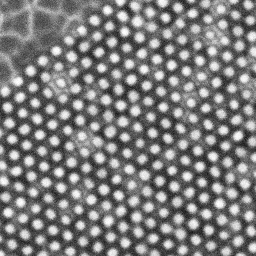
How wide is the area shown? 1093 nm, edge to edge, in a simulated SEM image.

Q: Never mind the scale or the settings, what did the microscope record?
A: a regular array of raised bodies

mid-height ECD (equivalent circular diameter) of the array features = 33.8 nm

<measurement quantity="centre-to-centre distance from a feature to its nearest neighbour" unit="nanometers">67.4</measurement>